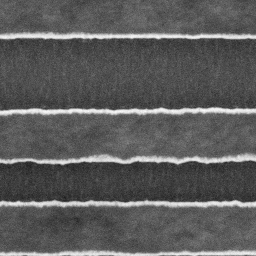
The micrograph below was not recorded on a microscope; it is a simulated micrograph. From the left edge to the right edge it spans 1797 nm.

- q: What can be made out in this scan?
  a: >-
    lines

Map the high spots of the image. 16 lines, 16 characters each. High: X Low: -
XXXXXXXXXXXXXXXX
XXXXXXXXXXXXXXXX
----------------
----------------
----------------
----------------
----------------
XXXXXXXXXXXXXXXX
XXXXXXXXXXXXXXXX
XXXXXXXXXXXXXXXX
----------------
----------------
----------------
XXXXXXXXXXXXXXXX
XXXXXXXXXXXXXXXX
XXXXXXXXXXXXXXXX